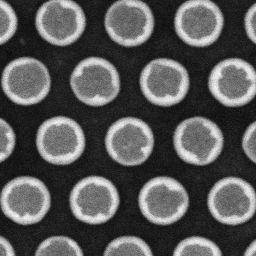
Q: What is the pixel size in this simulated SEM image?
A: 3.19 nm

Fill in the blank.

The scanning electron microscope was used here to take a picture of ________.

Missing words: a regular array of raised bodies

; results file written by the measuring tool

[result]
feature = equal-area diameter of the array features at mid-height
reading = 147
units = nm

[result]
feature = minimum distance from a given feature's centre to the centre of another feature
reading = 218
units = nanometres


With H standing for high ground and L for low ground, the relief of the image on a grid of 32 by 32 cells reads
HLLLLLHHHLLLLLLHHHLLLLLHHHLLLLLL
HHLLLHHHHHLLLLHHHHHLLLHHHHHLLLLH
HHLLLHHHHHLLLHHHHHHLLLHHHHHHLLLH
HHLLLHHHHHLLLHHHHHHLLLHHHHHHLLLH
HLLLLHHHHHLLLLHHHHHLLLLHHHHLLLLH
LLLLLLLLLLLLLLLHHLLLLLLLHHLLLLLL
LLLLLLLLLLLLLLLLLLLLLLLLLLLLLLLL
LLHHLLLLLLLHHLLLLLLLLLLLLLLLLLLL
LHHHHHLLLLHHHHLLLLHHHHHLLLLHHHHL
LHHHHHLLLHHHHHHLLLHHHHHLLLHHHHHH
HHHHHHLLLHHHHHHLLLHHHHHLLLHHHHHH
LHHHHHLLLHHHHHLLLLHHHHHLLLLHHHHH
LLHHHLLLLLHHHHLLLLLHHHLLLLLHHHHL
LLLLLLLLLLLLLLLLLLLLLLLLLLLLLLLL
LLLLLLLLLLLLLLLLLLLLLLLLLLLLLLLL
HLLLLLHHHLLLLLHHHHLLLLLHHHHLLLLL
HLLLLHHHHHLLLLHHHHHLLLHHHHHLLLLH
HHLLLHHHHHLLLHHHHHHLLLHHHHHHLLLH
HLLLLHHHHHLLLLHHHHHLLLHHHHHLLLLH
HLLLLHHHHHLLLLHHHHLLLLLHHHHLLLLH
LLLLLLLLLLLLLLLLHLLLLLLLLLLLLLLL
LLLLLLLLLLLLLLLLLLLLLLLLLLLLLLLL
LLHHLLLLLLLHHLLLLLLHHLLLLLLLHHLL
LHHHHHLLLHHHHHLLLLHHHHHLLLLHHHHL
HHHHHHLLLHHHHHHLLLHHHHHLLLHHHHHH
HHHHHHLLLHHHHHHLLLHHHHHLLLHHHHHH
LHHHHHLLLHHHHHLLLLHHHHHLLLLHHHHH
LLHHLLLLLLHHHLLLLLLHHHLLLLLHHHHL
LLLLLLLLLLLLLLLLLLLLLLLLLLLLLLLL
LLLLLLLLLLLLLLLLLLLLLLLLLLLLLLLL
HLLLLHHHHLLLLLHHHHLLLLLHHHLLLLLL
HHLLLHHHHHLLLHHHHHHLLLHHHHHLLLLH